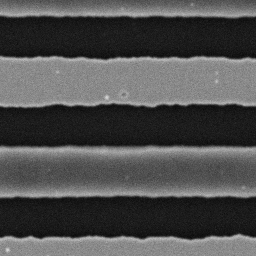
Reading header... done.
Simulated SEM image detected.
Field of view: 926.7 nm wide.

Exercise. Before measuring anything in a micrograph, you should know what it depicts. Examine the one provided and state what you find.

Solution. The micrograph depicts lines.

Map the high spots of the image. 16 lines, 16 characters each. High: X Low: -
XXXXXXXXXXXXXXXX
----------------
----------------
----------------
XXXXXXXXXXXXXXXX
XXXXXXXXXXXXXXXX
XXXXXX--XXXX-X-X
----------------
----------------
XXXXXXXXXXXXXXXX
XXXXXXXXXXXXXXXX
XXXXXXXXXXXXXXXX
----------------
----------------
----------------
XXXXXXXXXXXXXXXX